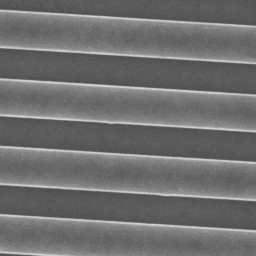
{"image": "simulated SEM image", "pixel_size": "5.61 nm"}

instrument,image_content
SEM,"one or a few lines or trenches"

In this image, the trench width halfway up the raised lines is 173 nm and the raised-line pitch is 382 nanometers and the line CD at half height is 211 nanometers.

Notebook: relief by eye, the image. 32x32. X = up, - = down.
--------------------------------
XXXX----------------------------
XXXXXXXXXXXXXXXXXXX-------------
XXXXXXXXXXXXXXXXXXXXXXXXXXXXXXXX
XXXXXXXXXXXXXXXXXXXXXXXXXXXXXXXX
XXXXXXXXXXXXXXXXXXXXXXXXXXXXXXXX
---------XXXXXXXXXXXXXXXXXXXXXXX
-------------------------XXXXXXX
--------------------------------
--------------------------------
XXXXXXXXXX----------------------
XXXXXXXXXXXXXXXXXXXXXXXXXX------
XXXXXXXXXXXXXXXXXXXXXXXXXXXXXXXX
XXXXXXXXXXXXXXXXXXXXXXXXXXXXXXXX
--XXXXXXXXXXXXXXXXXXXXXXXXXXXXXX
------------------XXXXXXXXXXXXXX
--------------------------------
--------------------------------
XXX-----------------------------
XXXXXXXXXXXXXXXXXX--------------
XXXXXXXXXXXXXXXXXXXXXXXXXXXXXXXX
XXXXXXXXXXXXXXXXXXXXXXXXXXXXXXXX
XXXXXXXXXXXXXXXXXXXXXXXXXXXXXXXX
--------XXXXXXXXXXXXXXXXXXXXXXXX
------------------------XXXXXXXX
--------------------------------
--------------------------------
XXXXXXXXX-----------------------
XXXXXXXXXXXXXXXXXXXXXXXXX-------
XXXXXXXXXXXXXXXXXXXXXXXXXXXXXXXX
XXXXXXXXXXXXXXXXXXXXXXXXXXXXXXXX
XXXXXXXXXXXXXXXXXXXXXXXXXXXXXXXX